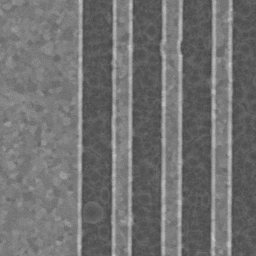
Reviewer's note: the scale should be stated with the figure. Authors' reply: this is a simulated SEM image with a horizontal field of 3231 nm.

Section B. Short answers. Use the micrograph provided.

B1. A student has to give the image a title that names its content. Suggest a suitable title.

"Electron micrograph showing parallel lines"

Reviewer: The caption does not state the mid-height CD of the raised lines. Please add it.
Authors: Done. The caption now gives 210 nanometres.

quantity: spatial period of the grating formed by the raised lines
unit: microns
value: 0.629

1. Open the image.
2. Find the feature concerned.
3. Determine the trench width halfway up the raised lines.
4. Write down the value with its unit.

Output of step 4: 421 nm